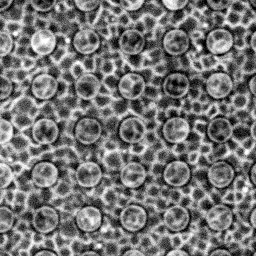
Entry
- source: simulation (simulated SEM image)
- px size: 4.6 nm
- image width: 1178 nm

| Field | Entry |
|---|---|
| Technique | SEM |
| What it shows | a regular array of raised bodies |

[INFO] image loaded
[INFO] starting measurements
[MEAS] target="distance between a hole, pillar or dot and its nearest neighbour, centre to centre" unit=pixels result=43.2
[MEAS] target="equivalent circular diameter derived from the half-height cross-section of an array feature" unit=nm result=111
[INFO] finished